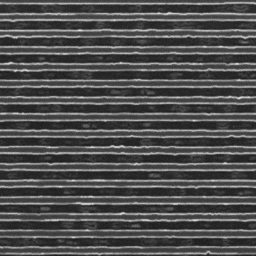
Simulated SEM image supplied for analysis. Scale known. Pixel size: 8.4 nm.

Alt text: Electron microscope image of parallel lines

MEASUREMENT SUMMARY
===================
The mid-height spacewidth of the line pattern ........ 75.6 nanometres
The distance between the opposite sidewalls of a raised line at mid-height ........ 60.9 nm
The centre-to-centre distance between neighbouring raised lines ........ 0.14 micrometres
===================